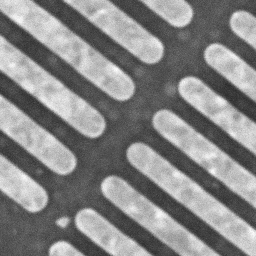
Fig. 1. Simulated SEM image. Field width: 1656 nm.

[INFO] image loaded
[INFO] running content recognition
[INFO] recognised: groups of lines, slits or small figures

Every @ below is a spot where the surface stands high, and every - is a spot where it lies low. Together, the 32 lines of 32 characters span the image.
@@@@-----@@@@@----@@@@@---------
@@@@@@----@@@@@----@@@@@------@-
--@@@@@----@@@@@@----@@@-----@@@
---@@@@@----@@@@@@-----------@@@
----@@@@@@----@@@@@-----------@@
@-----@@@@@----@@@@@-----------@
@@@----@@@@@----@@@@------@@@---
@@@@----@@@@@-----@@------@@@@--
@@@@@----@@@@@@------------@@@@-
-@@@@@-----@@@@@------------@@@@
--@@@@@@----@@@@@-----@@@----@@@
----@@@@@----@@@@-----@@@@@---@@
@----@@@@@-------------@@@@@----
@@----@@@@@@-------------@@@@---
@@@-----@@@@@------@@@----@@@@@-
@@@@@----@@@@------@@@@----@@@@@
-@@@@@----@@@-------@@@@@---@@@@
--@@@@@--------------@@@@@----@@
---@@@@@--------@@@---@@@@@----@
----@@@@@-------@@@@----@@@@----
@-----@@@--------@@@@----@@@@@--
@@@----@@---------@@@@----@@@@@-
@@@@---------@@----@@@@@----@@@@
@@@@@--------@@@----@@@@@----@@@
-@@@@@-------@@@@@----@@@@----@@
---@@@--------@@@@@----@@@@@---@
----------@@----@@@@----@@@@@---
----------@@@----@@@@@---@@@@@--
----------@@@@----@@@@@----@@@@-
-----------@@@@@----@@@@----@@@@
-------@----@@@@@----@@@@----@@@
------@@@@----@@@@----@@@@@----@